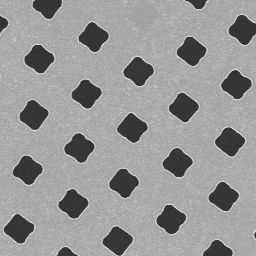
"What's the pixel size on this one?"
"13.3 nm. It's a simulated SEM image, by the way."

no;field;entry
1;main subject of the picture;a regular array of holes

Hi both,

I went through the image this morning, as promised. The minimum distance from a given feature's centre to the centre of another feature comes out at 737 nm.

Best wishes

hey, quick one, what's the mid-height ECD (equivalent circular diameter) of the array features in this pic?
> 26.4 px